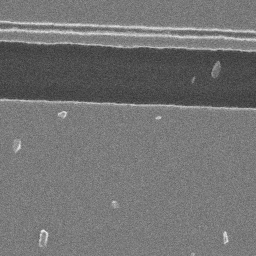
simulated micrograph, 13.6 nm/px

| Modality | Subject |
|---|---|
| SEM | lines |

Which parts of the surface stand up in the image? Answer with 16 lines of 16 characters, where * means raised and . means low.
****************
****************
****************
................
................
................
******..........
****************
****************
****************
****************
****************
****************
****************
****************
****************